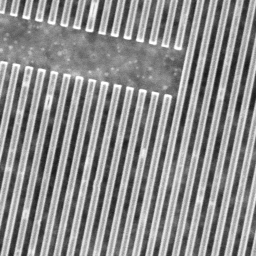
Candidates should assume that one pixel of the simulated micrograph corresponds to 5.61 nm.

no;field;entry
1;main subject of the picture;parallel lines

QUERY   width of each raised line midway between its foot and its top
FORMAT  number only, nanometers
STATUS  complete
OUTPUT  35.1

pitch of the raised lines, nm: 72.3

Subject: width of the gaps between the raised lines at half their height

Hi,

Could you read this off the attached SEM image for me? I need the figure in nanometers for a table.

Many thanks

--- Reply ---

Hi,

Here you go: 35.1